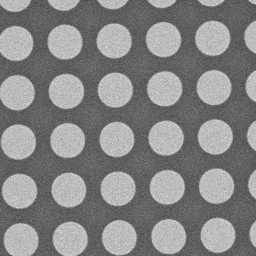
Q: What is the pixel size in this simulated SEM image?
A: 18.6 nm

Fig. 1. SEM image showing an array of small figures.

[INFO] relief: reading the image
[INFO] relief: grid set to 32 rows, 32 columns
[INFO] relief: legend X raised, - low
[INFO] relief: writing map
XXXX--XXXX---XXX---XX----XX-----
--------------------------------
--------------------------------
-XX----XX----XXX---XXX---XXX---X
XXXX--XXXX--XXXX--XXXX--XXXXX--X
XXXX--XXXX--XXXX--XXXX---XXXX--X
XXXX--XXXX---XXX---XXX---XXX----
--------------------------------
--------------------------------
--X----XX----XXX---XXX---XXX---X
XXXX--XXXX--XXXX---XXXX--XXXX--X
XXXX--XXXX--XXXX--XXXXX--XXXX--X
XXXX--XXXX---XXX---XXX---XXX----
-XX-----------------------------
--------------------------------
--------X-----X-----XX----XX----
-XXX---XXX---XXXX--XXXX--XXXX--X
XXXX--XXXXX-XXXXX--XXXX--XXXX--X
XXXX---XXX---XXX---XXX---XXXX---
-XXX----X-----X-----------------
--------------------------------
--------------------XX----XX----
-XXX---XXX---XXXX--XXXX--XXXX--X
XXXX--XXXXX--XXXX--XXXX--XXXX--X
XXXXX--XXXX--XXXX--XXXX--XXXX---
-XXX---XXX----XX----------------
--------------------------------
--------------------XX----XX----
-XXX---XXX---XXXX--XXXX--XXXX--X
-XXXX--XXXX--XXXX--XXXX--XXXX--X
-XXXX--XXXX--XXXX--XXXX--XXXX---
-XXX---XXX----XX----XX----------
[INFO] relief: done